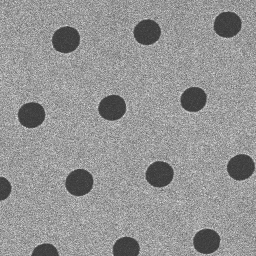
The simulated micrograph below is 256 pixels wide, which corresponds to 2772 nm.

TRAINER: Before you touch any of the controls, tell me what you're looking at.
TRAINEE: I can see a regular array of holes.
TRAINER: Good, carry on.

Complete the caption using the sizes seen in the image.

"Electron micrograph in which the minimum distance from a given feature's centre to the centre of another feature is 0.878 micrometres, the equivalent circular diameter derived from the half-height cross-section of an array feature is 0.295 µm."